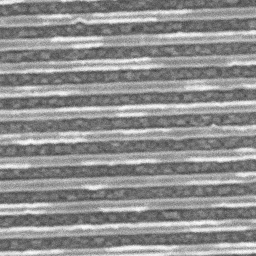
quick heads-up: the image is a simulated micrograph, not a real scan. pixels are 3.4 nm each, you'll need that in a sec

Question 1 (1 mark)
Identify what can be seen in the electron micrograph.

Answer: parallel lines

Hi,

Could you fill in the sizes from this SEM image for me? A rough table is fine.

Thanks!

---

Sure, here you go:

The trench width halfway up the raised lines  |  44.6 nm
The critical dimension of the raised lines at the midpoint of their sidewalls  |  0.0348 micrometres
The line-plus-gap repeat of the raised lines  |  23.5 px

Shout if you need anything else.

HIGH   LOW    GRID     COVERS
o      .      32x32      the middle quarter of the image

oooooooooooooooooooooooooooooooo
oooooo...ooo....................
................................
................................
....................ooo...oooooo
oooooooooooooooooooooooooooooooo
ooooooooooooooooooooooooooooo...
oo..............................
................................
................................
...............ooooooooooooooooo
oooooooooooooooooooooooooooooooo
ooooooooooooooooooooooooo...o...
oo..............................
................................
................................
.................o.ooooooooooooo
oooooooooooooooooooooooooooooooo
oooooooooooooooooooooooooooooo..
ooo.............................
................................
................................
.............ooooooooooooooooooo
oooooooooooooooooooooooooooooooo
ooooooooooooooooooooooo.........
................................
................................
................................
.........ooooooooooooooooooooooo
oooooooooooooooooooooooooooooooo
ooooooooooooooooooo.............
................................